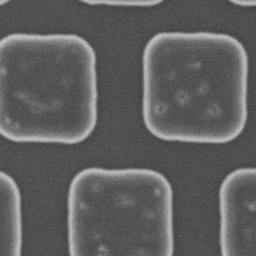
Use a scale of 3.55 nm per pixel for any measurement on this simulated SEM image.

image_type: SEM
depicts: raised bodies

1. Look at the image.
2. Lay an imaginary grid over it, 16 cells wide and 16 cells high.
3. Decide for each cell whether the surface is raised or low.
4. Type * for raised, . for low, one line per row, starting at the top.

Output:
................
................
*****.....*****.
******...******.
******...******.
******...******.
******...******.
******...******.
*****.....*****.
................
................
*....*****....**
*...*******...**
*...*******...**
*...*******...**
*...*******...**